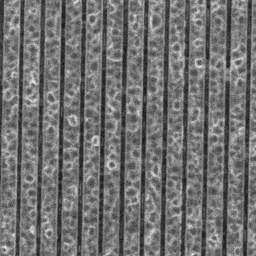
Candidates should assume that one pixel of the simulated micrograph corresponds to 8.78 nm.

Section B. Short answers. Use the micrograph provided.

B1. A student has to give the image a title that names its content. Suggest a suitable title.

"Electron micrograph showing parallel lines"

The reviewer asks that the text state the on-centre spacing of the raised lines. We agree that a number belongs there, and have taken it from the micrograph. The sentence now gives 181 nm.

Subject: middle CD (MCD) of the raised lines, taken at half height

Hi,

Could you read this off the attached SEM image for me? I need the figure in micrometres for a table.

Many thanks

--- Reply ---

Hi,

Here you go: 0.141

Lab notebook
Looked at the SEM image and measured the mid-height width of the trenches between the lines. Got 43.9 nanometers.